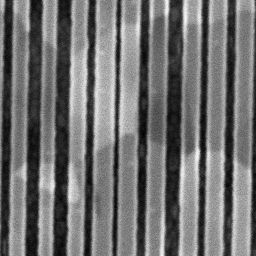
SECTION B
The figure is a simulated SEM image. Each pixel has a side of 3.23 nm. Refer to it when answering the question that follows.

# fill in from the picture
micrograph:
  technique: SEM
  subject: parallel lines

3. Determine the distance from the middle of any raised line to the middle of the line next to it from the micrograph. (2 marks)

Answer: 0.0906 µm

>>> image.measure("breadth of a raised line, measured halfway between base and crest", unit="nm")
56.2